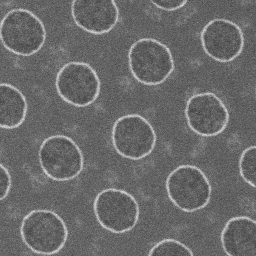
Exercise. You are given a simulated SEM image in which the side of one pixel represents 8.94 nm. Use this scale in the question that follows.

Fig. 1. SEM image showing a regular array of raised bodies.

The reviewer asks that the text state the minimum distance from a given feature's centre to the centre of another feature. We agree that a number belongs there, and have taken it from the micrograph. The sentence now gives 0.673 micrometres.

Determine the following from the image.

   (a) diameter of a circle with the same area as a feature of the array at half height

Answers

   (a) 42.7 pixels